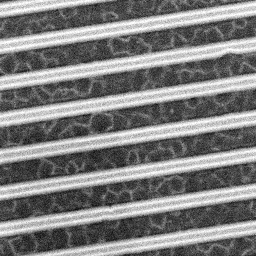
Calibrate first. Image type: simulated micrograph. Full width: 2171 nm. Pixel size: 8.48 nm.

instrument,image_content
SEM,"parallel lines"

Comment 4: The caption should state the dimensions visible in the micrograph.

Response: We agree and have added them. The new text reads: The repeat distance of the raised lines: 306 nanometers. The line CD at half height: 99.5 nanometers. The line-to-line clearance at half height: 207 nm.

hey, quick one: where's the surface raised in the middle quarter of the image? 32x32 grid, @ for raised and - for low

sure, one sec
----@@@@@@@@@@@@@@@@@-----------
@@@@@@@@@@@@@@------------------
@@@@@@@@------------------------
@-------------------------------
--------------------------------
-------------------------------@
-------------------------@@@@@@@
-----------------@@@@@@@@@@@@@@@
----------@@@@@@@@@@@@@@@@@@@---
---@@@@@@@@@@@@@@@@@@@----------
@@@@@@@@@@@@@@@@----------------
@@@@@@@@@-----------------------
@@------------------------------
--------------------------------
-------------------------------@
------------------------@@@@@@@@
------------------@@@@@@@@@@@@@@
-----------@@@@@@@@@@@@@@@@@@@@-
-----@@@@@@@@@@@@@@@@@@---------
@@@@@@@@@@@@@@@@@---------------
@@@@@@@@@@----------------------
@@@@----------------------------
--------------------------------
--------------------------------
-------------------------@@@@@@@
-------------------@@@@@@@@@@@@@
------------@@@@@@@@@@@@@@@@@@@-
------@@@@@@@@@@@@@@@@@@--------
@@@@@@@@@@@@@@@@@@--------------
@@@@@@@@@@@---------------------
@@@@@---------------------------
--------------------------------